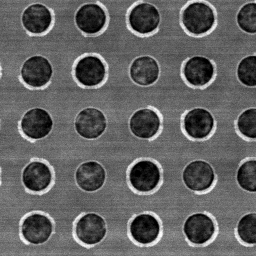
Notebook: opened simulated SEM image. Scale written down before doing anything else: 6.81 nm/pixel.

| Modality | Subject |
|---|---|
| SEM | a regular array of holes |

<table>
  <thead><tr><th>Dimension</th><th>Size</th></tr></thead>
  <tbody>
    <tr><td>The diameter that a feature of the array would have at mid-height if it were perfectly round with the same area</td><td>0.207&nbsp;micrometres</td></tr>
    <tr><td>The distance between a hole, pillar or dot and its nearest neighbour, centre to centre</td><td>0.358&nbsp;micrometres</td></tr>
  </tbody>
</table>